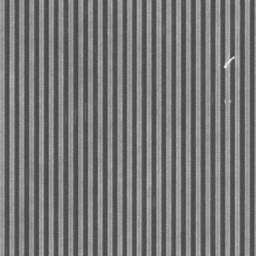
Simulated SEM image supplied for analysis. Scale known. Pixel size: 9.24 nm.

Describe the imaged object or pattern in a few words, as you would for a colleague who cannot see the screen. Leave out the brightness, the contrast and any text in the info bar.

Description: parallel lines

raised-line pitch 90.6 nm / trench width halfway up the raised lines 56.6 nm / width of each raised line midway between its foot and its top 40.4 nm